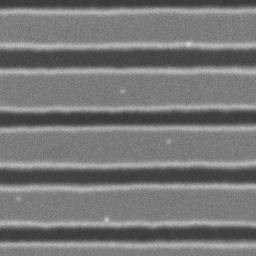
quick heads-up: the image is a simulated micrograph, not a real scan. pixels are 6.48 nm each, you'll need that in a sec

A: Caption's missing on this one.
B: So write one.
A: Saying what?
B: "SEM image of lines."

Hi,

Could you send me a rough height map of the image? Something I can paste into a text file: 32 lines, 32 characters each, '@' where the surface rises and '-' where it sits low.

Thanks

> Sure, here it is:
--------------------------------
@@@@@@@@@@@@@@@@@@@@@@@@@@@@@@@@
@@@@@@@@@@@@@@@@@@@@@@@@@@@@@@@@
@@@@@@@@@@@@@@@@@@@@@@@@@@@@@@@@
@@@@@@@@@@@@@@@@@@@@@@@@@@@@@@@@
@@@@@@@@@@@@@@@@@@@@@@@@@@@@@@@@
--------------------------------
--------------------------------
--------------------------------
@@@@@@@@@@@@@@@@@@@@@@@@@@@@@@@@
@@@@@@@@@@@@@@@@@@@@@@@@@@@@@@@@
@@@@@@@@@@@@@@@@@@@@@@@@@@@@@@@@
@@@@@@@@@@@@@@@@@@@@@@@@@@@@@@@@
@@@@@@@@@@@@@@@@@@@@@@@@@@@@@@@@
--------------------------------
--------------------------------
@@@@@@@@@@@@@@@@@@@@@@@@@@@@@@@@
@@@@@@@@@@@@@@@@@@@@@@@@@@@@@@@@
@@@@@@@@@@@@@@@@@@@@@@@@@@@@@@@@
@@@@@@@@@@@@@@@@@@@@@@@@@@@@@@@@
@@@@@@@@@@@@@@@@@@@@@@@@@@@@@@@@
--------------------------------
--------------------------------
@@@@@@@@@@@@@@@@@@@@@@@@@@@@@@@@
@@@@@@@@@@@@@@@@@@@@@@@@@@@@@@@@
@@@@@@@@@@@@@@@@@@@@@@@@@@@@@@@@
@@@@@@@@@@@@@@@@@@@@@@@@@@@@@@@@
@@@@@@@@@@@@@@@@@@@@@@@@@@@@@@@@
--------------------------------
--------------------------------
@@@@@@@@@@@@@@@@@@@@@@@@@@@@@@@@
@@@@@@@@@@@@@@@@@@@@@@@@@@@@@@@@